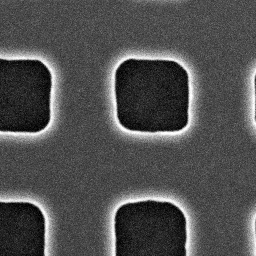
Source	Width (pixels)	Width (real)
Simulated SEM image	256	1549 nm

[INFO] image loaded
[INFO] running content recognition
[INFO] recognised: holes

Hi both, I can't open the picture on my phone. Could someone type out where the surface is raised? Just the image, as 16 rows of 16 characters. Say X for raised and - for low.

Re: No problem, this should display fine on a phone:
XXXXXXXXXXXXXXXX
XXXXXXXXXXXXXXXX
XXXXXXXXXXXXXXXX
XXXXXXXXXXXXXXXX
---XXXX-----XXXX
---XXXX-----XXXX
---XXXX-----XXXX
---XXXX-----XXXX
XXXXXXXXXXXXXXXX
XXXXXXXXXXXXXXXX
XXXXXXXXXXXXXXXX
XXXXXXXXXXXXXXXX
XXXXXXXXX-XXXXXX
---XXXX-----XXXX
---XXXX-----XXXX
---XXXX-----XXXX